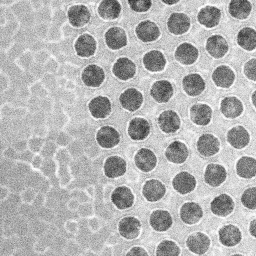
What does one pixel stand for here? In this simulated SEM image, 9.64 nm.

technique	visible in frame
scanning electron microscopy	a regular array of raised bodies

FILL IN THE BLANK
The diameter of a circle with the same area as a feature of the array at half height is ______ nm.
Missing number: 242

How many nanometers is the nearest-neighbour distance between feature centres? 298